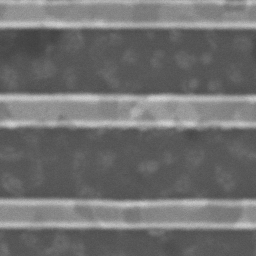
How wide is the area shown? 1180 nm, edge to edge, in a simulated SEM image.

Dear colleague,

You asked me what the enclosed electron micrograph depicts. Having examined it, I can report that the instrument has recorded one or a few lines or trenches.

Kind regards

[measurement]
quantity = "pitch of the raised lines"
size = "101 px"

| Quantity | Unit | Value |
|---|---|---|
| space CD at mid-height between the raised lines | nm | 352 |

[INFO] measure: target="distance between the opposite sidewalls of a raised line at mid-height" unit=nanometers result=107